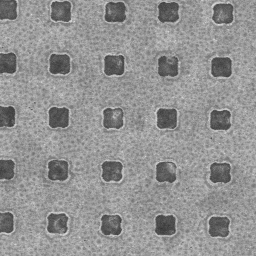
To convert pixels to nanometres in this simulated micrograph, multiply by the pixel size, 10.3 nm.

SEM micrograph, a regular array of holes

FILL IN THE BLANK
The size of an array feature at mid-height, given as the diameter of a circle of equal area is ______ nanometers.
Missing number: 238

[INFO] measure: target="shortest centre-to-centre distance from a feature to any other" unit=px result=53